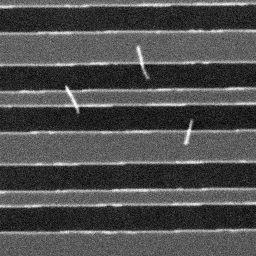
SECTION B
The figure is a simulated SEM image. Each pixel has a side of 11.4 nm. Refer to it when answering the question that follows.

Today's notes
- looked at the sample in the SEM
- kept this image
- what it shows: lines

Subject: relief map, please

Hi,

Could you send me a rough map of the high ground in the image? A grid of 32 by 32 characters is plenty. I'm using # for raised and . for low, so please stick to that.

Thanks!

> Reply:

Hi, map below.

###############################.
................................
................................
................................
################################
################################
################################
################################
................................
................................
................................
..##############################
################################
................................
................................
................................
...............#################
################################
################################
################################
##########......................
................................
................................
................................
################################
##########################......
................................
................................
................................
################################
################################
################################